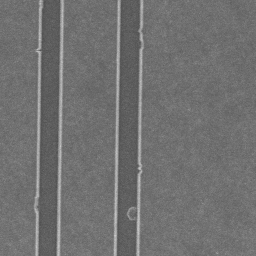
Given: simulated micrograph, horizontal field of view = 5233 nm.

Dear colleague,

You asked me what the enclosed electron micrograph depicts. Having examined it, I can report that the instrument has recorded one or a few lines or trenches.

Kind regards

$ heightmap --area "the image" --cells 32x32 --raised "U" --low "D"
UUUUUDDDUUUUUUUDDDUUUUUUUUUUUUUU
UUUUUDDDUUUUUUUDDDUUUUUUUUUUUUUU
UUUUUDDDUUUUUUUDDDUUUUUUUUUUUUUU
UUUUUDDDUUUUUUUDDDUUUUUUUUUUUUUU
UUUUUDDDUUUUUUUDDDUUUUUUUUUUUUUU
UUUUUDDDUUUUUUUDDDUUUUUUUUUUUUUU
UUUUUDDDUUUUUUUDDDUUUUUUUUUUUUUU
UUUUUDDDUUUUUUUDDDUUUUUUUUUUUUUU
UUUUUDDDUUUUUUUDDDUUUUUUUUUUUUUU
UUUUUDDDUUUUUUUDDDUUUUUUUUUUUUUU
UUUUUDDDUUUUUUUDDDUUUUUUUUUUUUUU
UUUUUDDDUUUUUUUDDDUUUUUUUUUUUUUU
UUUUUDDDUUUUUUUDDDUUUUUUUUUUUUUU
UUUUUDDDUUUUUUUDDDUUUUUUUUUUUUUU
UUUUUDDDUUUUUUUDDDUUUUUUUUUUUUUU
UUUUUDDDUUUUUUUDDDUUUUUUUUUUUUUU
UUUUUDDDUUUUUUUDDUUUUUUUUUUUUUUU
UUUUUDDDUUUUUUUDDUUUUUUUUUUUUUUU
UUUUUDDDUUUUUUUDDUUUUUUUUUUUUUUU
UUUUUDDDUUUUUUUDDUUUUUUUUUUUUUUU
UUUUUDDDUUUUUUUDDUUUUUUUUUUUUUUU
UUUUUDDUUUUUUUDDDUUUUUUUUUUUUUUU
UUUUUDDUUUUUUUDDDUUUUUUUUUUUUUUU
UUUUUDDUUUUUUUDDDUUUUUUUUUUUUUUU
UUUUUDDUUUUUUUDDDUUUUUUUUUUUUUUU
UUUUDDDUUUUUUUDDDUUUUUUUUUUUUUUU
UUUUUDDUUUUUUUDDDUUUUUUUUUUUUUUU
UUUUUDDUUUUUUUDDDUUUUUUUUUUUUUUU
UUUUUDDUUUUUUUDDDUUUUUUUUUUUUUUU
UUUUUDDUUUUUUUDDDUUUUUUUUUUUUUUU
UUUUUDDUUUUUUUDDDUUUUUUUUUUUUUUU
UUUUUDDUUUUUUUDDDUUUUUUUUUUUUUUU